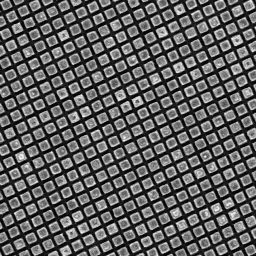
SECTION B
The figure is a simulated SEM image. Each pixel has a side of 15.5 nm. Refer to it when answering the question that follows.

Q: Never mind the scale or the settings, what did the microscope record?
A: a regular array of raised bodies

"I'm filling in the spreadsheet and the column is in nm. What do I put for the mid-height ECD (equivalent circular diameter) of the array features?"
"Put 160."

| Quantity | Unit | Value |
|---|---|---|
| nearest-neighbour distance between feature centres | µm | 0.196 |